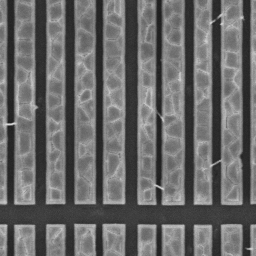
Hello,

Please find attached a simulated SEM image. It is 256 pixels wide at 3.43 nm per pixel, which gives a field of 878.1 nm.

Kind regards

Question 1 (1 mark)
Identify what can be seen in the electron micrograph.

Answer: parallel lines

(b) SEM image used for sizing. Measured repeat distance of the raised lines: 101 nm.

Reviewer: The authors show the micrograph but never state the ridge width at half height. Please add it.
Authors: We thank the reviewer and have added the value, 0.0643 µm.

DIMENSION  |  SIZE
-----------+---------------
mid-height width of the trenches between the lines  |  36.4 nm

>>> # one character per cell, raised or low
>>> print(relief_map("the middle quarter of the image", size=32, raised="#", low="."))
...#####..#####....####..#####..
...#####..#####....####..#####..
...#####..#####....####..#####..
...#####..#####....####..#####..
...#####..#####....####..#####..
...#####..#####....####..#####..
...#####..#####....####..#####..
...#####..#####....####..#####..
...#####..#####....####..#####..
...#####..#####....####..#####..
...#####..#####....####..#####..
...#####..#####....####..#####..
...#####..#####....####..#####..
...#####..#####....####.######..
...#####..#####....####..#####..
...#####..#####....####..#####..
...#####..#####....####..#####..
...#####..#####....####..#####..
...#####..#####....####..#####..
...#####..#####....####..#####..
...#####..#####....####..#####..
...#####..#####....####..#####..
...#####..#####....####..#####..
...#####..#####....####..#####..
...#####..#####....####..#####..
...#####..#####....####..#####..
...#####..#####....####..#####..
...#####..#####....####..#####..
...#####..#####....####..#####..
...#####..#####....####..#####..
...####...#####....####..#####..
...####...#####....####..#####..